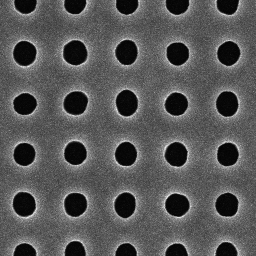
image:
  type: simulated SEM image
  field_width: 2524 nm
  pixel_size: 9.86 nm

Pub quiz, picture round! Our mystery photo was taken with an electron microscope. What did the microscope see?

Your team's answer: a regular array of holes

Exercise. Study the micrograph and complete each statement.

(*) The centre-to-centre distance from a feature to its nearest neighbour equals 494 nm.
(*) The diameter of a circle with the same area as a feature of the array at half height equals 233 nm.